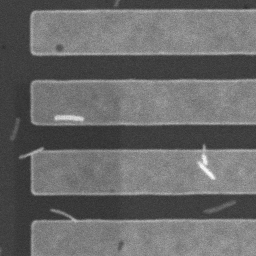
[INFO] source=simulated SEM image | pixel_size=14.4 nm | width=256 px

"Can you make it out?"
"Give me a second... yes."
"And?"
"wiring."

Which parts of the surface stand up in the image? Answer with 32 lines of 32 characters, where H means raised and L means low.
LLLLLLLLLLLLLLLLLLLLLLLLLLLLLLLL
LLLLHHHHHHHHHHHHHHHHHHHHHHHHHHHH
LLLLHHHHHHHHHHHHHHHHHHHHHHHHHHHH
LLLLHHHHHHHHHHHHHHHHHHHHHHHHHHHH
LLLLHHHHHHHHHHHHHHHHHHHHHHHHHHHH
LLLLHHHHHHHHHHHHHHHHHHHHHHHHHHHH
LLLLHHHHHHHHHHHHHHHHHHHHHHHHHHHH
LLLLLLLLLLLLLLLLLLLLLLLLLLLLLLLL
LLLLLLLLLLLLLLLLLLLLLLLLLLLLLLLL
LLLLLLLLLLLLLLLLLLLLLLLLLLLLLLLL
LLLLHHHHHHHHHHHHHHHHHHHHHHHHHHHH
LLLLHHHHHHHHHHHHHHHHHHHHHHHHHHHH
LLLLHHHHHHHHHHHHHHHHHHHHHHHHHHHH
LLLLHHHHHHHHHHHHHHHHHHHHHHHHHHHH
LLLLHHHHHHHHHHHHHHHHHHHHHHHHHHHH
LLLLHHHHHHHHHHHHHHHHHLLLLLLLLLLL
LLLLLLLLLLLLLLLLLLLLLLLLLLLLLLLL
LLLLLLLLLLLLLLLLLLLLLLLLLLLLLLLL
LLLLLLLLLLLLLLLLLLLLLLLLLLLLLLLL
LLLLHHHHHHHHHHHHHHHHHHHHHHHHHHHH
LLLLHHHHHHHHHHHHHHHHHHHHHHHHHHHH
LLLLHHHHHHHHHHHHHHHHHHHHHHHHHHHH
LLLLHHHHHHHHHHHHHHHHHHHHHHHHHHHH
LLLLHHHHHHHHHHHHHHHHHHHHHHHHHHHH
LLLLLLLLLLLLLLLLLLLLLLLLLLLLLLLL
LLLLLLLLLLLLLLLLLLLLLLLLLLLLLLLL
LLLLLLLLLLLLLLLLLLLLLLLLLLLLLLLL
LLLLLLLLLLLLLLLLLLLLLLLLLLLLLLLL
LLLLHHHHHHHHHHHHHHHHHHHHHHHHHHHH
LLLLHHHHHHHHHHHHHHHHHHHHHHHHHHHH
LLLLHHHHHHHHHHHHHHHHHHHHHHHHHHHH
LLLLHHHHHHHHHHHHHHHHHHHHHHHHHHHH